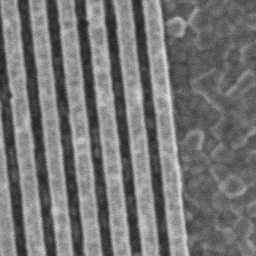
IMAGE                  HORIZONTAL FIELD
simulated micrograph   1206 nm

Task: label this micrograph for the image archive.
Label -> parallel lines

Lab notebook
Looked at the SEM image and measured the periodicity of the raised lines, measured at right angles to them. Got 134 nm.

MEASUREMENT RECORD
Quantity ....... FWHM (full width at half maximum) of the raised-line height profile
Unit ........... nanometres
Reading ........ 66.8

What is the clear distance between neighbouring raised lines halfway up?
66.8 nanometers